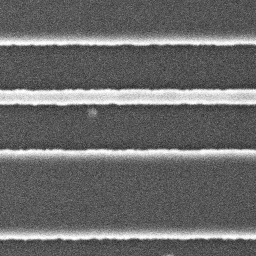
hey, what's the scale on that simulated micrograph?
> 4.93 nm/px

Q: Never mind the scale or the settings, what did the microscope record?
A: lines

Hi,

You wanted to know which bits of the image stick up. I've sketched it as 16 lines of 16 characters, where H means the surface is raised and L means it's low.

HHHHHHHHHHHHHHHH
HHHHHHHHHHHHHHHH
HHHHHHHHHHHHHHHH
LLLLLLLLLLLLLLLL
LLLLLLLLLLLLLLLL
LLLLLLLLLLLLLLLL
LLHHHLLLLLLLLLLH
LLLLLLLLLLLLLLLL
LLLLLLLLLLLLLLLL
HHHHHHHHHHHHHHHH
HHHHHHHHHHHHHHHH
HHHHHHHHHHHHHHHH
HHHHHHHHHHHHHHHH
HHHHHHHHHHHHHHHH
HHHHHHHHHHHHHHHH
LLLLLLLLLLLLLLLL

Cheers